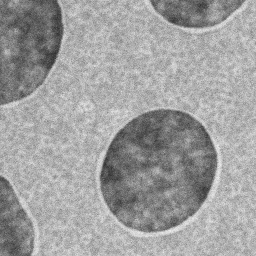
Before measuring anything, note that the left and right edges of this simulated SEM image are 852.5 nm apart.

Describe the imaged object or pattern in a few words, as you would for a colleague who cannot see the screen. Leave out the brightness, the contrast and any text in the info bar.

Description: holes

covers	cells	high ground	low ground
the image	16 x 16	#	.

....######.....#
....#######...##
....############
....############
...#############
..##############
################
########....####
#######......###
#######.......##
######........##
.#####.......###
.######......###
..#####.....####
..#######.######
..##############